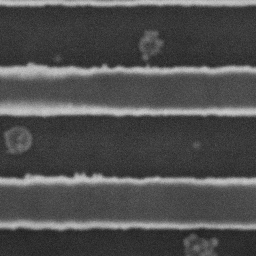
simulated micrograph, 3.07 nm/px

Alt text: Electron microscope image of lines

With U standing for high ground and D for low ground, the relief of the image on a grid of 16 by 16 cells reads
DDDDDDDDDDDDDDDD
DDDDDDDDDDDDDDDD
DDDDDDDDDDDDDDDD
DDDDDDDDDDDDDDDD
UUUUUUUUUUUUUUUU
UUUUUUUUUUUUUUUU
UUUUUUUUUUUUUUUU
DDDDDDDDDDDDDDDD
DDDDDDDDDDDDDDDD
DDDDDDDDDDDDDDDD
DDDDDDDDDDDDDDDD
UUUUUUUUUUUUUUUU
UUUUUUUUUUUUUUUU
UUUUUUUUUUUUUUUU
DDDDDDDDDDDDDDDD
DDDDDDDDDDDDDDDD